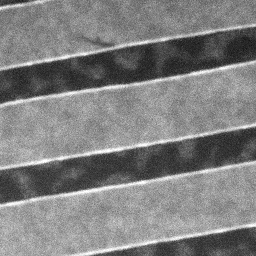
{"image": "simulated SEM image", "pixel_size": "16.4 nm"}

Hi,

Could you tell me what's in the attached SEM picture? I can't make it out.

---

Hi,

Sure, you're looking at one or a few lines or trenches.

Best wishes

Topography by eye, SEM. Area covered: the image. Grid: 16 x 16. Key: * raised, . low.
****************
****************
**********......
*****...........
............****
......**********
****************
****************
************....
*******.........
*.............**
........********
..**************
****************
**************..
********........